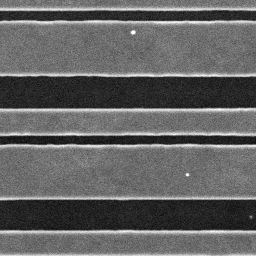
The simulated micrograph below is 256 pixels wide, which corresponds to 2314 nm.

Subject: lines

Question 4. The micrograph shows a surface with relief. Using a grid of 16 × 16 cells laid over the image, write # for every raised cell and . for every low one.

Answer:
################
################
################
################
################
................
................
################
################
################
################
################
................
................
################
################